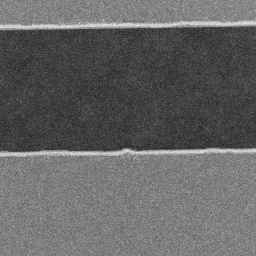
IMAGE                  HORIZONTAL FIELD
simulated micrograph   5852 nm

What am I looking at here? one or a few lines or trenches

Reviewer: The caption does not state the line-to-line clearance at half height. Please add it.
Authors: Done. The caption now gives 2890 nm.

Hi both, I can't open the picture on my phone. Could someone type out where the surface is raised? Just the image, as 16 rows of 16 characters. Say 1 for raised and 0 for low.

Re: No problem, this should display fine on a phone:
1111111111111111
1111111111100000
0000000000000000
0000000000000000
0000000000000000
0000000000000000
0000000000000000
0000000000000000
0000000000000000
0000000000001111
1111111111111111
1111111111111111
1111111111111111
1111111111111111
1111111111111111
1111111111111111